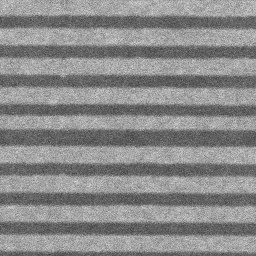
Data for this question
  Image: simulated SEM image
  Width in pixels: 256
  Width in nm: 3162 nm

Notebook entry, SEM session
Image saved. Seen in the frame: parallel lines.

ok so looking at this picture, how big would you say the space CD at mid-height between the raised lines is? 187 nanometers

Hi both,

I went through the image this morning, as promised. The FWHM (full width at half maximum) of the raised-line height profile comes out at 0.176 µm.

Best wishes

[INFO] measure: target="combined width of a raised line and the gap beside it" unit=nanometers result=364